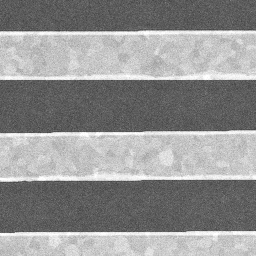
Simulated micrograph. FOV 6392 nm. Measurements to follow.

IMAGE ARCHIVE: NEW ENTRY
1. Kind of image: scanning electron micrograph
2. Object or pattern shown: lines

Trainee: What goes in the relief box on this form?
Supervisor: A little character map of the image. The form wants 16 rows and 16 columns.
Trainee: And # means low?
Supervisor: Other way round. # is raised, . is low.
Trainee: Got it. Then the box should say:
................
................
################
################
################
................
................
................
################
################
################
................
................
................
................
################